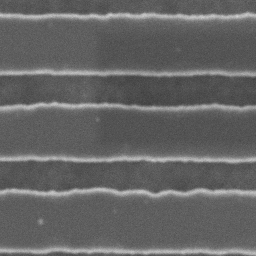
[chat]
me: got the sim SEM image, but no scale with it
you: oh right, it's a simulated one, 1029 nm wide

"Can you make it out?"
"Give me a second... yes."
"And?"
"lines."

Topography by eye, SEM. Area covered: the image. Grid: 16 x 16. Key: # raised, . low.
................
################
################
################
################
................
...#............
################
################
################
................
................
################
################
################
################